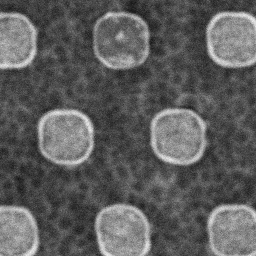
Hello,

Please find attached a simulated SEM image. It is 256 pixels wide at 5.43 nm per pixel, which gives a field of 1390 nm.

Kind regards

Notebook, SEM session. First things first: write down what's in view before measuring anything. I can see raised bodies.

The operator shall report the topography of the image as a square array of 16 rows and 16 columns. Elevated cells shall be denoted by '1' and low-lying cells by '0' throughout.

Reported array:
0000000000000000
1100001110000111
1100001110000111
1100000100000111
0000000000000000
0000000000000000
0000000000000000
0001100000110000
0011110000111000
0001110000111000
0000000000000000
0000000000000000
0000000000000000
1100001110000111
1100001110000111
1100001110000111